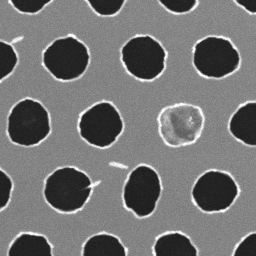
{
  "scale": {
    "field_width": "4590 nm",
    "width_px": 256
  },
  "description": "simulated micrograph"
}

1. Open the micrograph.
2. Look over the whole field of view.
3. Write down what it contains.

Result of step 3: a regular array of holes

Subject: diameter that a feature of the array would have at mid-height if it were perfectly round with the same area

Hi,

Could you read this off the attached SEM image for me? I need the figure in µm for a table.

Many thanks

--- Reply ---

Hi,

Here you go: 0.767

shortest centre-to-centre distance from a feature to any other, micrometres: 1.3